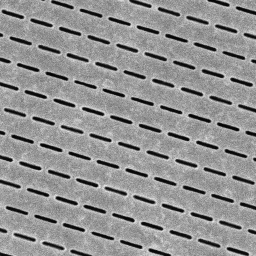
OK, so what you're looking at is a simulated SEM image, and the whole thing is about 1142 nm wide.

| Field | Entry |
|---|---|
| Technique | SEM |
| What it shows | a regular array of holes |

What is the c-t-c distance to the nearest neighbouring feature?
122 nanometres